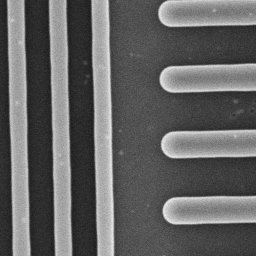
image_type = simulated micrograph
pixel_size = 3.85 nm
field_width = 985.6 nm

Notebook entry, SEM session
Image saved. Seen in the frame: groups of lines, slits or small figures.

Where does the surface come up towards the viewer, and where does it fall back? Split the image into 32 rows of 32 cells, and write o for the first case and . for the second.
.oo...oo....oo......oooooooooooo
.oo...oo....oo......oooooooooooo
.oo...oo....oo......oooooooooooo
.oo...oo....oo..................
.oo...oo....oo..................
.oo...oo....oo..................
.oo...oo....oo..................
.oo...oo....oo..................
.oo...oo....oo.......ooooooooooo
.oo....o....oo......oooooooooooo
.oo....o....oo......oooooooooooo
.oo....oo...oo..................
.oo....oo...oo..................
.oo....oo...oo..................
.oo....oo...oo..................
.oo....oo...oo..................
.oo....oo...oo........oooooooooo
.oo....oo...oo......oooooooooooo
.oo....oo...oo......oooooooooooo
.oo....oo...oo.......oooooooooo.
.oo....oo...oo..................
.oo....oo...oo..................
.oo....oo...oo..................
.oo....oo...oo..................
..o....oo...oo..................
..o....oo...oo.......ooooooooooo
..oo...oo...oo......oooooooooooo
..oo...oo...oo.......ooooooooooo
..oo...oo...oo..................
..oo...oo...oo..................
..oo...oo...oo..................
..oo...oo...oo..................